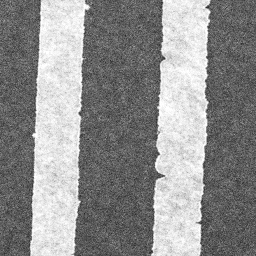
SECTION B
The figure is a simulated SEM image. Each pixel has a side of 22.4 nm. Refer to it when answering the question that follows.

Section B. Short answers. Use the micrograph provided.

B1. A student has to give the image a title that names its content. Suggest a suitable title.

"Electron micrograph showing one or a few lines or trenches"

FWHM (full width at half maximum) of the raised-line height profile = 972 nm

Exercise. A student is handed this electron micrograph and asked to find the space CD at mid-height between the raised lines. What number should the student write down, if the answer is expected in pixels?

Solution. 79.5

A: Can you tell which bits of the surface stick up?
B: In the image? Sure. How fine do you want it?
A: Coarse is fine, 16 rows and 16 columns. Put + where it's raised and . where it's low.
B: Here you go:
...++.....+++...
...++.....+++...
...++.....+++...
..+++.....+++...
..+++.....+++...
..+++.....+++...
..+++.....+++...
..+++.....+++...
..+++.....+++...
..+++.....+++...
..+++.....+++...
..+++.....+++...
..+++.....+++...
..+++.....++....
..+++.....+++...
..+++.....++....